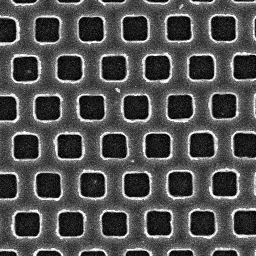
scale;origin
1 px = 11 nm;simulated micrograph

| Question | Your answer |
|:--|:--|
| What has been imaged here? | a regular array of holes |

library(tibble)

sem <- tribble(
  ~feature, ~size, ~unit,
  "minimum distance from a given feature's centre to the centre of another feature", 481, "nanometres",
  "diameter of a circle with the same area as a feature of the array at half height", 0.303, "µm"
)